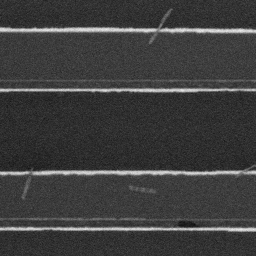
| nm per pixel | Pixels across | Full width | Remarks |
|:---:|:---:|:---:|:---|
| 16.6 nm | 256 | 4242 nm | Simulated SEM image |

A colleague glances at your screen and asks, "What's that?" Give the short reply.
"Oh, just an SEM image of lines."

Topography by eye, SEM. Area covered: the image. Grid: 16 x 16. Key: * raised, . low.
................
................
****************
****************
****************
****************
................
................
................
................
................
****************
****************
****************
................
................